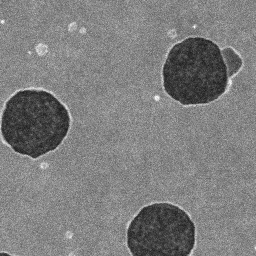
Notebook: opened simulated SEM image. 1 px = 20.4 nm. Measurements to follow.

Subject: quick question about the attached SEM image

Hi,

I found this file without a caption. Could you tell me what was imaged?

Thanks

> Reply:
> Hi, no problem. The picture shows holes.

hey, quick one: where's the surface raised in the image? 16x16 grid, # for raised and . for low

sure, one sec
################
################
############.###
##########....##
##########....##
##########....##
....############
....############
....############
#..#############
################
################
################
#########...####
########....####
########....####